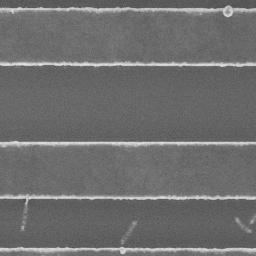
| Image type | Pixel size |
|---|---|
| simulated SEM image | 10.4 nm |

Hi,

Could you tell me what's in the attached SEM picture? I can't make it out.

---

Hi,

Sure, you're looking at lines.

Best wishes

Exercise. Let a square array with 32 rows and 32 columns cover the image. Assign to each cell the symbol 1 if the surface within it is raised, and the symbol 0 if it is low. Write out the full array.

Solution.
00000000000000000000000000000000
11111111111111111111111111111111
11111111111111111111111111111111
11111111111111111111111111111111
11111111111111111111111111111111
11111111111111111111111111111111
11111111111111111111111111111111
11111111111111111111111111111111
00000000000000000000000000000000
00000000000000000000000000000000
00000000000000000000000000000000
00000000000000000000000000000000
00000000000000000000000000000000
00000000000000000000000000000000
00000000000000000000000000000000
00000000000000000000000000000000
00000000000000000000000000000000
00000000000000000000000000000000
11111111111111111111111111111111
11111111111111111111111111111111
11111111111111111111111111111111
11111111111111111111111111111111
11111111111111111111111111111111
11111111111111111111111111111111
11111111111111111111111111111111
00000000000000000000000000000000
00000000000000000000000000000000
00000000000000000000000000000000
00000000000000000000000000000000
00000000000000000000000000000000
00000000000000000000000000000000
11111111111111111111111111111111